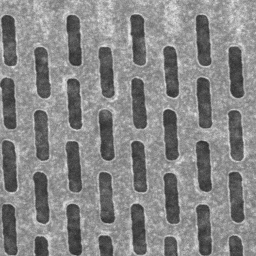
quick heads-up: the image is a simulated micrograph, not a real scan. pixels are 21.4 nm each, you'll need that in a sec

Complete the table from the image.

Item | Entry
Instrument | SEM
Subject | a regular array of holes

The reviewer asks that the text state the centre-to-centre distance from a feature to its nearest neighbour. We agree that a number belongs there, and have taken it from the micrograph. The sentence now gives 958 nm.